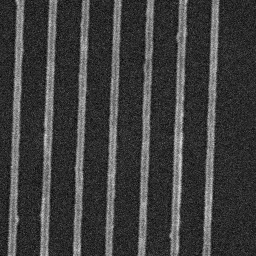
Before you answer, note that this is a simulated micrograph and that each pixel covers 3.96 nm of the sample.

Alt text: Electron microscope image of parallel lines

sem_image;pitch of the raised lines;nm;128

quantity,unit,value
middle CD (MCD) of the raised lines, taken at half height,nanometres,25.2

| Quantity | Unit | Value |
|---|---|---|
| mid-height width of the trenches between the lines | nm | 101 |